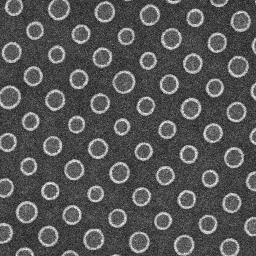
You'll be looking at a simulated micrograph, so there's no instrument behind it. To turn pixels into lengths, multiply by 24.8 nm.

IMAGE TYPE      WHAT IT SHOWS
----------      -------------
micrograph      a regular array of raised bodies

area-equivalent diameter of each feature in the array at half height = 17.9 px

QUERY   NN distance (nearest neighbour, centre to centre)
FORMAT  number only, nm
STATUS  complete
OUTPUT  785